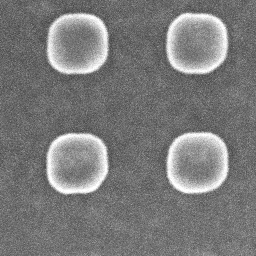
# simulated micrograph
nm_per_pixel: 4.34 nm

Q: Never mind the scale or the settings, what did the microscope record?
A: raised bodies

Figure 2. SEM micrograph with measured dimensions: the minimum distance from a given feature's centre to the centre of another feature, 518 nanometers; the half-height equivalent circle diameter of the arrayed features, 0.265 micrometres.